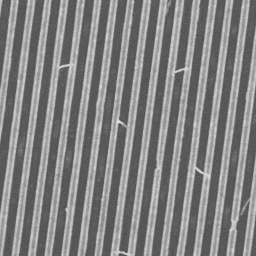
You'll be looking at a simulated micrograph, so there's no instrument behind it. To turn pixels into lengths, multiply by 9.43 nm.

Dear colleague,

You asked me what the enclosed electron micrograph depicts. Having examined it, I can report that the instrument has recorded parallel lines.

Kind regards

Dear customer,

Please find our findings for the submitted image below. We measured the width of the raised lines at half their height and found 53.7 nm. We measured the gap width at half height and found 98.2 nm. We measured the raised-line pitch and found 154 nm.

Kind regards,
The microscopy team